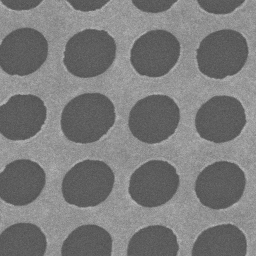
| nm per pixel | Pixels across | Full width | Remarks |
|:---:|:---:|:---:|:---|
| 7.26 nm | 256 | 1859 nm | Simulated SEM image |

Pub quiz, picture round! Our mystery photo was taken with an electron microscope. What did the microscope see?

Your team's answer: a regular array of holes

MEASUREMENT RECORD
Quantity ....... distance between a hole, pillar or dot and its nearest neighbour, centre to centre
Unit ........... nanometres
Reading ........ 474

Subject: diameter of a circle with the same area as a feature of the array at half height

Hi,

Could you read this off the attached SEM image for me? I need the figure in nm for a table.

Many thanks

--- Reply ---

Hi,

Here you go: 365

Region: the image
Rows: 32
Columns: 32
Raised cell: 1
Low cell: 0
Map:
00000111100001111000001110000011
11111111111111111100111111000111
11111111111111111111111111111111
11101111111111111111111111111111
10000111100000111100001111000011
00000011000000111000001110000001
00000011000000010000000110000001
00000011000000110000001110000001
00000111000000111000001110000011
11111111110011111100111111001111
11111111111111111111111111111111
11111111111111111111111111111111
10000111100000111000001111000011
00000011000000111000001110000011
00000011000000110000001110000001
00000111000000110000001100000001
00000111000001110000001110000011
10011111100011111000011111000111
11111111111111111111111111111111
11111111111111111111111111111111
10000111110001111100011111000111
00000011000000111000001110000011
00000011000000110000001110000001
00000111000000110000001100000001
00000111000000110000001110000011
10001111100011111000111110000111
11111111111111111111111111111111
11111111111111111111111111111111
10000111110001111100011111000011
00000011100000111000001110000001
00000011000000110000001100000001
00000011000000110000001100000001